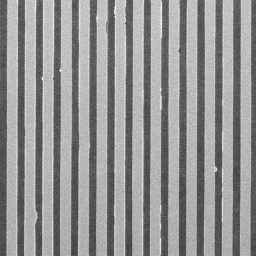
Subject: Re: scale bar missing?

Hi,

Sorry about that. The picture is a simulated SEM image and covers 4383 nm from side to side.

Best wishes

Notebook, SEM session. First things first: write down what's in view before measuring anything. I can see parallel lines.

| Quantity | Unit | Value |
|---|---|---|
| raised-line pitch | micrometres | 0.307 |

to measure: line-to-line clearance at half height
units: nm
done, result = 133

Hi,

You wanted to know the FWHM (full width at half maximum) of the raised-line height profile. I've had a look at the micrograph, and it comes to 173 nm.